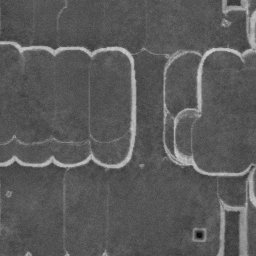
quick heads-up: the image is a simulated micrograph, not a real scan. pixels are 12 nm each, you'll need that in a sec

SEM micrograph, wiring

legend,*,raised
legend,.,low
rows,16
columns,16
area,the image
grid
................
................
................
********.....***
********....****
********....****
********....****
********...*****
********...*****
********...*****
............****
................
................
................
................
................